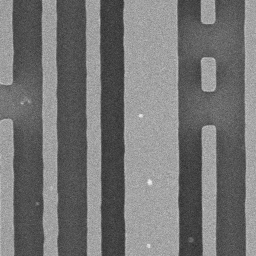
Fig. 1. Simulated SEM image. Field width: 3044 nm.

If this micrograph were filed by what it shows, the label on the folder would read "groups of lines, slits or small figures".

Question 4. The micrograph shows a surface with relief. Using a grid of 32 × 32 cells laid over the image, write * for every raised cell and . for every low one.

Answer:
**...**....*....******...**....*
*....**....*....******...**....*
*....**....**...******...**....*
*....**....**...******.........*
**...**....**...******.........*
**...**....**...******.........*
**...**....*....******.........*
**...**....**...******...**....*
**...**....**...******...**....*
**...**....**...******...**....*
*....**....**...******...**....*
.....**....**...******.........*
.....**....**...******.........*
.....**....**...******.........*
.....**....**...******.........*
**...**....**...******.........*
**...**....**...******...**....*
**...**....**...******...**....*
**...**....**...******...**....*
**...**....**...******...**....*
**....*....**...******...**....*
**....*....**...******...**....*
**....*....**...******...**....*
**....*....**...******...**....*
**...**....**...******...**....*
**....*....**...******...**....*
**...**....**...******...**....*
**...**....**...******...**....*
**...**....**...******...**....*
**....*....**...******...**....*
**....*....**...******...**....*
**....*....**...******...**....*